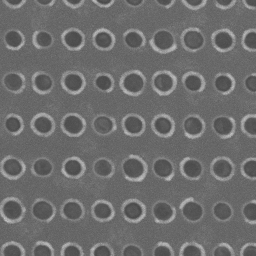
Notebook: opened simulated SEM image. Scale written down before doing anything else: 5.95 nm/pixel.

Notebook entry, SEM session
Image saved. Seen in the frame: a regular array of holes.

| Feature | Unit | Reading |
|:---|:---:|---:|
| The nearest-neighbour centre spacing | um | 0.177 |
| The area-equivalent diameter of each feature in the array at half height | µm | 0.106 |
